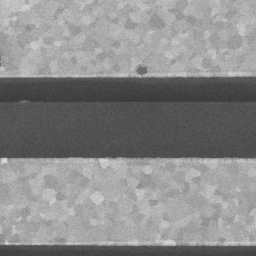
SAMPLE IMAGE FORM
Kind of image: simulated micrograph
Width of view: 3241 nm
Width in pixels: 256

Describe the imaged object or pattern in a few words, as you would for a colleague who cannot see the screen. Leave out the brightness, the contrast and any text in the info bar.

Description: lines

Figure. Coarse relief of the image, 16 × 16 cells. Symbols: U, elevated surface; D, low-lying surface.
UUUUUUUUUUUUUUUU
UUUUUUUUUUUUUUUU
UUUUUUUUUUUUUUUU
UUUUUUUUUUUUUUUU
UUUUUUUUUUUUUUUU
DDDDDDDDDDDDDDDD
DDDDDDDDDDDDDDDD
DDDDDDDDDDDDDDDD
DDDDDDDDDDDDDDDD
DDDDDDDDDDDDDDDD
UUUUUUUUUUUUUUUU
UUUUUUUUUUUUUUUU
UUUUUUUUUUUUUUUU
UUUUUUUUUUUUUUUU
UUUUUUUUUUUUUUUU
DDDDDDDDDDDDDDDD